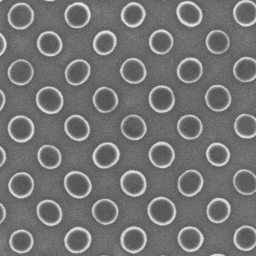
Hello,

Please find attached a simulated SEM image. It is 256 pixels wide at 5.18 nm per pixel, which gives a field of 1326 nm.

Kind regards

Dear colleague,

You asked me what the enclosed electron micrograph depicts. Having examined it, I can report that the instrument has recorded a regular array of raised bodies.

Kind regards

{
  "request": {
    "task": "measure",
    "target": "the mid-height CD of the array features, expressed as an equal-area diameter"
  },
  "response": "125 nm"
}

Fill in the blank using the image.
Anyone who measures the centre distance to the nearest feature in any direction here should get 0.204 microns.